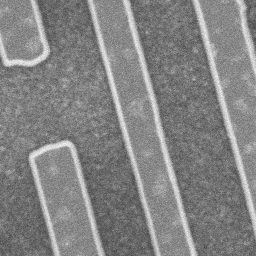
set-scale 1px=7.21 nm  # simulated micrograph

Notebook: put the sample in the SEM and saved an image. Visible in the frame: one or a few lines or trenches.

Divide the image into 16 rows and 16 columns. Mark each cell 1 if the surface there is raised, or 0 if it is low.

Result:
1100001100001110
1110001100000110
1110001110000111
1110000110000111
0000000110000111
0000000110000011
0000000111000011
0000000011000011
0000000011000011
0011100011000001
0011100011100001
0011100001100001
0001100001100000
0001110001100000
0001110001110000
0001110000110000